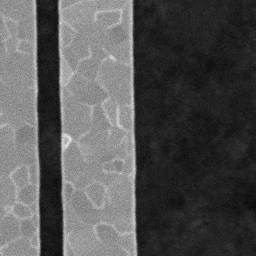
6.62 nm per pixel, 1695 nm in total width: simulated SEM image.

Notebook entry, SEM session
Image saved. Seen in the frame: wiring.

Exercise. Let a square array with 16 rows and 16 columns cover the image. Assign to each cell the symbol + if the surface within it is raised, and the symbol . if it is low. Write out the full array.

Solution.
++..++++........
++..++++........
++..++++........
++..++++........
++..++++........
++..++++........
++..++++........
++..++++........
++..++++........
++..++++........
++..++++........
++..++++........
++..++++........
++..++++........
++..++++........
++..++++........